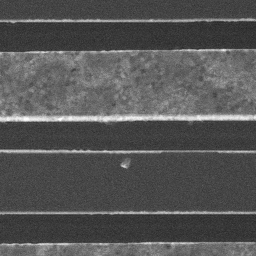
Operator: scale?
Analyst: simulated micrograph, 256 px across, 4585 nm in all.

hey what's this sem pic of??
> lines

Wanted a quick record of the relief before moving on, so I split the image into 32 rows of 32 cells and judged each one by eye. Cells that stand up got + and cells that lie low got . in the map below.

++++++++++++++++++++++++++++++++
++++++++++++++++++++++++++++++++
++++++++++++++++++++++++++++++++
................................
................................
................................
...+++++++++++++++++++++++++++++
++++++++++++++++++++++++++++++++
++++++++++++++++++++++++++++++++
++++++++++++++++++++++++++++++++
++++++++++++++++++++++++++++++++
++++++++++++++++++++++++++++++++
++++++++++++++++++++++++++++++++
++++++++++++++++++++++++++++++++
++++++++++++++++++++++++++++++++
................................
................................
................................
................................
++++++++++++++++++++++++++++++++
++++++++++++++++++++++++++++++++
++++++++++++++++++++++++++++++++
++++++++++++++++++++++++++++++++
++++++++++++++++++++++++++++++++
++++++++++++++++++++++++++++++++
++++++++++++++++++++++++++++++++
++++++++++++++++++++++++++++++++
................................
................................
................................
++++++++++++++++++++++++++++++++
++++++++++++++++++++++++++++++++